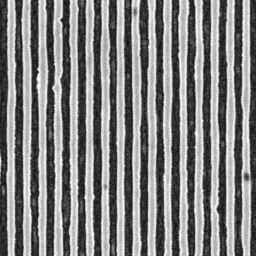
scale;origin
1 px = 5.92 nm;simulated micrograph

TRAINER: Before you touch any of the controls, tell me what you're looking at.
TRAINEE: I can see parallel lines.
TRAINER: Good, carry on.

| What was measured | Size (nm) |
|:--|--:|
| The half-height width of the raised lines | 45.9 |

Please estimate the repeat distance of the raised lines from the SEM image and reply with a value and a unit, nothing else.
0.0927 micrometres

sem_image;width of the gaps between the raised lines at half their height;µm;0.051